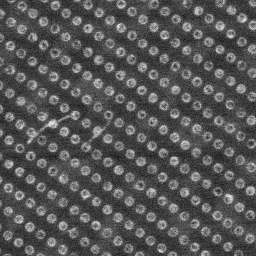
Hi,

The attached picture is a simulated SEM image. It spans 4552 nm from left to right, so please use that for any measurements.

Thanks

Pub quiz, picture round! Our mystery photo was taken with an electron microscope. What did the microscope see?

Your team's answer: a regular array of raised bodies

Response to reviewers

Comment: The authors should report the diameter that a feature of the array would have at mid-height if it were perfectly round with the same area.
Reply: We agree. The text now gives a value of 0.142 µm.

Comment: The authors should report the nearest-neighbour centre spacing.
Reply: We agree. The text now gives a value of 13.2 px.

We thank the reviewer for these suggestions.